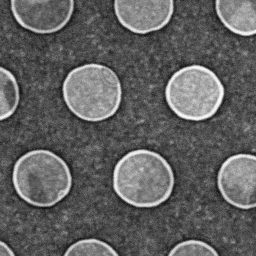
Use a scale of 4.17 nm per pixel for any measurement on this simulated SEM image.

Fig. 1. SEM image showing raised bodies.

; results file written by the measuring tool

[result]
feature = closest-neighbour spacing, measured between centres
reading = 412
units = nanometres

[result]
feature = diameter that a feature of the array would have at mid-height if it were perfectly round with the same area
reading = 225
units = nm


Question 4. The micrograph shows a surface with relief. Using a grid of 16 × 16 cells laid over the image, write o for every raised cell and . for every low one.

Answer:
.ooo...oooo...oo
.ooo....oo....oo
................
................
.....o.....oo...
o...ooo....ooo..
o...ooo....ooo..
................
................
..o.............
.ooo...oooo...oo
.ooo...oooo...oo
..oo....oo....oo
................
................
....ooo....oo...